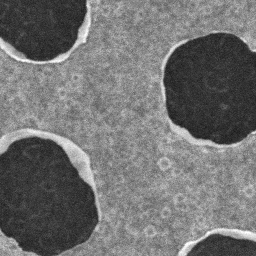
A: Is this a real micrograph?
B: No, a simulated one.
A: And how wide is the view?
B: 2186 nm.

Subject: holes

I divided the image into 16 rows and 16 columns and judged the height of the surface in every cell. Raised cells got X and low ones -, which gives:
-----XXXXXXXXXXX
-----XXXXXXXXXXX
-----XXXXXXX---X
X---XXXXXXX-----
XXXXXXXXXX------
XXXXXXXXXX------
XXXXXXXXXX------
XXXXXXXXXXX-----
XXXXXXXXXXXX---X
----XXXXXXXXXXXX
-----XXXXXXXXXXX
------XXXXXXXXXX
------XXXXXXXXXX
------XXXXXXXXXX
------XXXXXXXXXX
X----XXXXXXX----